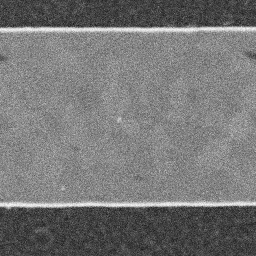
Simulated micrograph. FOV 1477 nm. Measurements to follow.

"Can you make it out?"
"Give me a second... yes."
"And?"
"one or a few lines or trenches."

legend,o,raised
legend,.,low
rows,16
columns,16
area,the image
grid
................
................
oooooooooooooooo
oooooooooooooooo
oooooooooooooooo
oooooooooooooooo
oooooooooooooooo
oooooooooooooooo
oooooooooooooooo
oooooooooooooooo
oooooooooooooooo
oooooooooooooooo
oooooooooooooooo
................
................
................